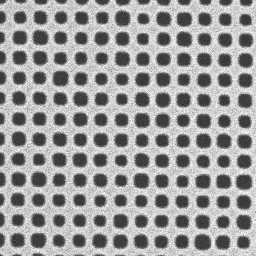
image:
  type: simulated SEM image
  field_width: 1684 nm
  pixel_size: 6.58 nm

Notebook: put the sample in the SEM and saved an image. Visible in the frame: a regular array of holes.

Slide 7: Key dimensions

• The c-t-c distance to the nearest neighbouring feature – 132 nm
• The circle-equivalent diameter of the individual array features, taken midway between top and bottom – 95.1 nm